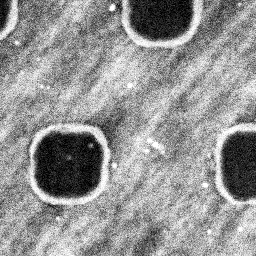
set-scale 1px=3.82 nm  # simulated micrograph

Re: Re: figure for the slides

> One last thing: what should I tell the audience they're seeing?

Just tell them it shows raised bodies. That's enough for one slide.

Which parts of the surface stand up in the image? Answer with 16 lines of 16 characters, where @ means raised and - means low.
@-------@@@@----
@-------@@@@----
---------@@-----
----------------
----------------
----------------
----------------
----------------
--@@@@--------@@
--@@@@@-------@@
--@@@@@-------@@
--@@@@--------@@
---@@----------@
----------------
----------------
----------------